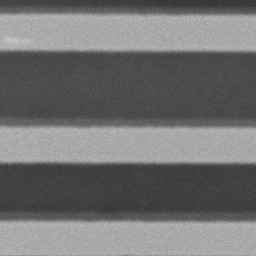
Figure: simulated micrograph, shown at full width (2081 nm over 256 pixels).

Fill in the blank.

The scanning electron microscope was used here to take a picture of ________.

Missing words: lines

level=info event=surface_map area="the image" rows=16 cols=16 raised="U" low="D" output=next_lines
UUUUUUUUUUDDDDDD
UUUUUUUUUUUUUUUU
UUUUUUUUUUUUUUUU
DDDDDDDDDDDDDDDD
DDDDDDDDDDDDDDDD
DDDDDDDDDDDDDDDD
DDDDDDDDDDDDDDDD
UDDDDDDUDDDDDDDD
UUUUUUUUUUUUUUUU
UUUUUUUUUUUUUUUU
DDDDDDDDDDDDDDDD
DDDDDDDDDDDDDDDD
DDDDDDDDDDDDDDDD
UUUUUUUUUUUUUUUU
UUUUUUUUUUUUUUUU
UUUUUUUUUUUUUUUU